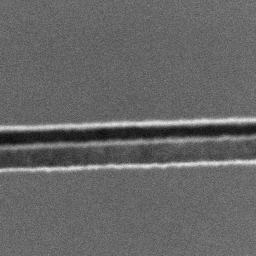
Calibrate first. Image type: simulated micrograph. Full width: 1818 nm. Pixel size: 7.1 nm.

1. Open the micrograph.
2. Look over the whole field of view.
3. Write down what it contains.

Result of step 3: lines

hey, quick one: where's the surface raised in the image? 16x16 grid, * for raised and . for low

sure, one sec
****************
****************
****************
****************
****************
****************
****************
****************
................
................
..**************
****************
****************
****************
****************
****************